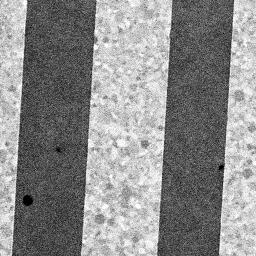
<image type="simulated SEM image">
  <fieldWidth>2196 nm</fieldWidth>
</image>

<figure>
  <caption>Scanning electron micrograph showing one or a few lines or trenches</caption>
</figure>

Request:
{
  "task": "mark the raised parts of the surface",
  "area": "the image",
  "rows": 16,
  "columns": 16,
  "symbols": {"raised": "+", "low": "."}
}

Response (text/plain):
++....+++++....+
++....+++++....+
++....+++++....+
+.....+++++...++
+.....++++....++
+.....++++....++
+.....++++....++
+.....++++....++
+.....++++....++
+....+++++....++
+....+++++....++
+....+++++....++
+....+++++....++
+....+++++....++
+....+++++....++
+....+++++....++